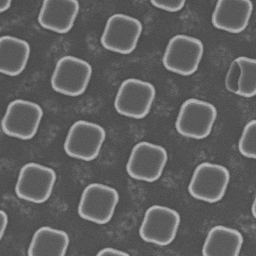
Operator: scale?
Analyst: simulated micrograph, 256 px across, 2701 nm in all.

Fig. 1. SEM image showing a regular array of raised bodies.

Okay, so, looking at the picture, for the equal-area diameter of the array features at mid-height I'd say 393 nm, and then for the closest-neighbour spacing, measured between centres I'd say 683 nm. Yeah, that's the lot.